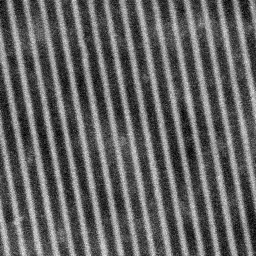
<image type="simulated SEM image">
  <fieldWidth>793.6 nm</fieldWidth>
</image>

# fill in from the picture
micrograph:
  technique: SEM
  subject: parallel lines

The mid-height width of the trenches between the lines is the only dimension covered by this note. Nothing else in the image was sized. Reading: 34.3 nanometres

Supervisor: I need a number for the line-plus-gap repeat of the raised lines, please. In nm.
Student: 49.3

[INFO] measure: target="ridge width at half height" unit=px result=4.68